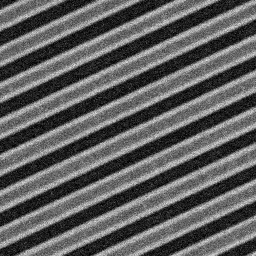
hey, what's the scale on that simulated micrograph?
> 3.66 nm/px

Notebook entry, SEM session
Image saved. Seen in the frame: parallel lines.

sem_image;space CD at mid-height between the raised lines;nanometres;64.4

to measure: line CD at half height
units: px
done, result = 14.9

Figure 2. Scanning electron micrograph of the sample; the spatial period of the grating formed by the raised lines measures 120 nanometres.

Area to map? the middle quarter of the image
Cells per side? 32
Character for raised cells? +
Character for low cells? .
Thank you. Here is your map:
++...........+++++++++..........
...........+++++++++..........++
.........+++++++++..........++++
.......+++++++++..........++++++
.....++++++++...........++++++++
...++++++++...........+++++++++.
.++++++++...........+++++++++...
+++++++...........++++++++......
+++++..........+++++++++........
+++..........+++++++++..........
+..........+++++++++..........++
.........+++++++++..........++++
.......+++++++++..........++++++
.....+++++++++..........++++++++
...+++++++++..........+++++++++.
.++++++++...........+++++++++...
+++++++...........+++++++++.....
+++++..........++++++++++.......
+++..........+++++++++..........
+..........+++++++++..........++
.........+++++++++..........++++
.......+++++++++..........++++++
.....+++++++++..........++++++++
...+++++++++..........+++++++++.
.+++++++++..........+++++++++...
++++++++..........+++++++++.....
+++++..........++++++++++.......
+++..........+++++++++..........
+..........+++++++++..........++
.........+++++++++..........++++
.......+++++++++..........++++++
.....+++++++++..........++++++++